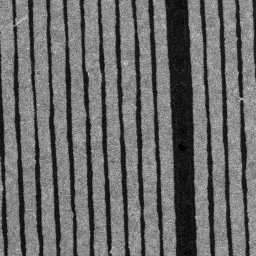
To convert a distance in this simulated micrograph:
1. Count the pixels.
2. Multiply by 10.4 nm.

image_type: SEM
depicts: parallel lines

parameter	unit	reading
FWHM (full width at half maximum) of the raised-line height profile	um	0.126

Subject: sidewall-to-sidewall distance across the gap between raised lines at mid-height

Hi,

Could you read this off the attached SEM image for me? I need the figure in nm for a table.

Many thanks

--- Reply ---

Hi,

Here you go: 48.2